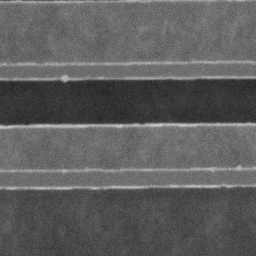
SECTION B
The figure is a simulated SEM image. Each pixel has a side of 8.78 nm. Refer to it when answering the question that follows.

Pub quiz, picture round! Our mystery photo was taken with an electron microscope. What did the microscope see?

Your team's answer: lines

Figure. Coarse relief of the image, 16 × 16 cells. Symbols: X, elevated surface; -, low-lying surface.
XXXXXXXXXXXXXXXX
XXXXXXXXXXXXXXXX
XXXXXXXXXXXXXXXX
XXXXXXXXXXXXXXXX
XXXXXXXXXXXXXXXX
----------------
----------------
----------------
XXXXXXXXXXXXXXXX
XXXXXXXXXXXXXXXX
XXXXXXXXXXXXXXXX
XXXXXXXXXXXXXXXX
----------------
----------------
----------------
----------------